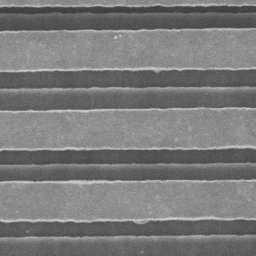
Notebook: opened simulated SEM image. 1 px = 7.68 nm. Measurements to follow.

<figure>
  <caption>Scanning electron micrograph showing lines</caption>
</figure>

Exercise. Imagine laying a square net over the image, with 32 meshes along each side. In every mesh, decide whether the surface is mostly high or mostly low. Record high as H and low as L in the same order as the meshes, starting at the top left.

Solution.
HHHHHHHHHHHHHHHHHHHHHHHHHHHHHHHH
LLLLLLLLLLLLLLLLLLLLLLLLLLLLLLLL
LLLLLLLLLLLLLLLLLLLLLLLLLLLLLLLL
LLLLLLLLLLLLLLLLLLLLLLLLLLLLLLLL
HHHHHHHHHHHHHHHHHHHHHHHHHHHHHHHH
HHHHHHHHHHHHHHHHHHHHHHHHHHHHHHHH
HHHHHHHHHHHHHHHHHHHHHHHHHHHHHHHH
HHHHHHHHHHHHHHHHHHHHHHHHHHHHHHHH
HHHHHHHHHHHHHHHHHHHHHHHHHHHHHHHH
LLLLLLLLLLLLLLLLLLLLLLLLLLLLLLLL
LLLLLLLLLLLLLLLLLLLLLLLLLLLLLLLL
LLLLLLLLLLLLLLLLLLLLLLLLLLLLLLLL
LLLLLLLLLLLLLLLLLLLLLLLLLLLLLLLL
LLLLLLLLLLLLLLLLLLLLLLLLHHLLHHHH
HHHHHHHHHHHHHHHHHHHHHHHHHHHHHHHH
HHHHHHHHHHHHHHHHHHHHHHHHHHHHHHHH
HHHHHHHHHHHHHHHHHHHHHHHHHHHHHHHH
HHHHHHHHHHHHHHHHHHHHHHHHHHHHHHHH
HHHHHHHHHHHHHHHHHHHHHHHHHHHHHLLH
LLLLLLLLLLLLLLLLLLLLLLLLLLLLLLLL
LLLLLLLLLLLLLLLLLLLLLLLLLLLLLLLL
LLLLLLLLLLLLLLLLLLLLLLLLLLLLLLLL
LLLLLLLLLLLLLLLLLLLLLLLLLLLLLLLL
HHHHHHHHHHHHHHHHHHHHHHHHHHHHHHHH
HHHHHHHHHHHHHHHHHHHHHHHHHHHHHHHH
HHHHHHHHHHHHHHHHHHHHHHHHHHHHHHHH
HHHHHHHHHHHHHHHHHHHHHHHHHHHHHHHH
HHHHHHHHHHHHHHHHHHHHHLLLHLLLLLLL
LLLLLLLLLLLLLLLLLLLLLLLLLLLLLLLL
LLLLLLLLLLLLLLLLLLLLLLLLLLLLLLLL
LLLLLLLLLLLLLLLLLLLLLLLLLLLLLLLL
LLLLLLLLLLLLLLLLLLLLLLLLLLLLLLLL